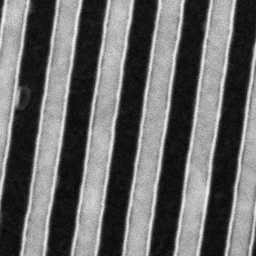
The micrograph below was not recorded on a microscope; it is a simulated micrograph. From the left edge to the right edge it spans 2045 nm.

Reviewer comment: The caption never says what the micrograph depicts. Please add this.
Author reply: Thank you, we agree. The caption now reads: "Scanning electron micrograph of parallel lines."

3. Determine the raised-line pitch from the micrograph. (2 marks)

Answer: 406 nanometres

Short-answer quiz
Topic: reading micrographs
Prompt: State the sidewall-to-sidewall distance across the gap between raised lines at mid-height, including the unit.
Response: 173 nm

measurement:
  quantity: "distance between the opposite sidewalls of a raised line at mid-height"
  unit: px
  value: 29.5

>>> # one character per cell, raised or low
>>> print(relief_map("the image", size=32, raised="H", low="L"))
HLLHHHHLLLHHHHLLHHHHLLLHHHLLLHHH
HLLHHHHLLLHHHLLLHHHHLLLHHHLLLHHH
LLLHHHHLLLHHHLLLHHHHLLLHHHLLLHHH
LLLHHHHLLHHHHLLLHHHHLLHHHHLLLHHH
LLLHHHHLLHHHHLLLHHHLLLHHHHLLLHHH
LLLHHHHLLHHHHLLLHHHLLLHHHHLLLHHH
LLLHHHLLLHHHHLLLHHHLLLHHHHLLHHHH
LLHHHHLLLHHHHLLHHHHLLLHHHLLLHHHH
LLHHHHLLLHHHLLLHHHHLLLHHHLLLHHHH
LLHHHHLLLHHHLLLHHHHLLLHHHLLLHHHH
LLHHHHLLHHHHLLLHHHHLLHHHHLLLHHHL
LLHHHHLLHHHHLLLHHHLLLHHHHLLLHHHL
LLHHHHLLHHHHLLLHHHLLLHHHHLLLHHHL
LLHHHLLLHHHHLLHHHHLLLHHHHLLHHHHL
LHHHHLLLHHHHLLHHHHLLLHHHLLLHHHHL
LHHHHLLLHHHLLLHHHHLLLHHHLLLHHHHL
LHHHHLLLHHHLLLHHHHLLLHHHLLLHHHHL
LHHHHLLLHHHLLLHHHHLLHHHHLLLHHHLL
LHHHHLLHHHHLLLHHHLLLHHHHLLLHHHLL
LHHHHLLHHHHLLLHHHLLLHHHHLLHHHHLL
HHHHLLLHHHHLLLHHHLLLHHHHLLHHHHLL
HHHHLLLHHHHLLHHHHLLLHHHLLLHHHHLL
HHHHLLLHHHHLLHHHHLLLHHHLLLHHHHLL
HHHHLLLHHHLLLHHHHLLHHHHLLLHHHHLL
HHHHLLHHHHLLLHHHHLLHHHHLLLHHHLLL
HHHHLLHHHHLLLHHHLLLHHHHLLLHHHLLL
HHHHLLHHHHLLLHHHLLLHHHHLLLHHHLLL
HHHLLLHHHHLLHHHHLLLHHHHLLHHHHLLL
HHHLLLHHHHLLHHHHLLLHHHLLLHHHHLLL
HHHLLLHHHHLLHHHHLLLHHHLLLHHHHLLL
HHHLLLHHHLLLHHHHLLLHHHLLLHHHHLLH
HHHLLHHHHLLLHHHHLLHHHHLLLHHHLLLH